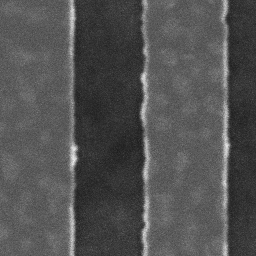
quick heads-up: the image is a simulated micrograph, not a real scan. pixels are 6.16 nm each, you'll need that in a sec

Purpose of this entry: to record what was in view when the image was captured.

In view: one or a few lines or trenches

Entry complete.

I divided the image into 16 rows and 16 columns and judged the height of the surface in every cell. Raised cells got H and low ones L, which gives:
HHHHHLLLLHHHHHLL
HHHHHLLLLHHHHHLL
HHHHHLLLLHHHHHLL
HHHHHLLLLHHHHHLL
HHHHHLLLLHHHHHLL
HHHHHLLLLHHHHHLL
HHHHHLLLLHHHHHLL
HHHHHLLLLHHHHHLL
HHHHHLLLLHHHHHLL
HHHHHLLLLHHHHHLL
HHHHHLLLLHHHHHLL
HHHHHLLLLHHHHHLL
HHHHHLLLLHHHHHLL
HHHHHLLLLHHHHHLL
HHHHHLLLLHHHHHLL
HHHHHLLLLHHHHHLL